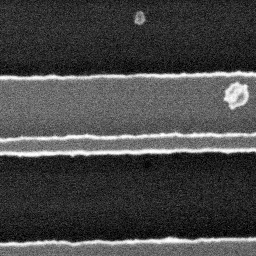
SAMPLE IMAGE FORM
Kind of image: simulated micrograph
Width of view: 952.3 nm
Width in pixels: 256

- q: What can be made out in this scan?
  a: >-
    lines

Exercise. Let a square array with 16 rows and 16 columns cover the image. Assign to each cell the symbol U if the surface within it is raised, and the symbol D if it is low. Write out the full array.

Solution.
DDDDDDDDDDDDDDDD
DDDDDDDDDDDDDDDD
DDDDDDDDDDDDDDDD
DDDDDDDDDDDDDDDD
DDDDDDDDDDDDDDDD
UUUUUUUUUUUUUUUU
UUUUUUUUUUUUUUUU
UUUUUUUUUUUUUUUU
UUUUUUUUUUUUUUUU
UUUUUUUUUUDDDDDD
DDDDDDDDDDDDDDDD
DDDDDDDDDDDDDDDD
DDDDDDDDDDDDDDDD
DDDDDDDDDDDDDDDD
DDDDDDDDDDDDDDDD
UUUUUUUUUUUUUUUU